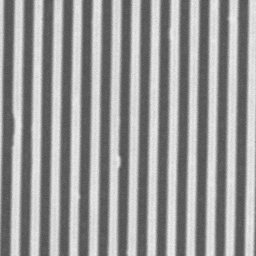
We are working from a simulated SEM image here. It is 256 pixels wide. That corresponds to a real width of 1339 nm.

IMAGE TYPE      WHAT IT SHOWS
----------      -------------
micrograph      parallel lines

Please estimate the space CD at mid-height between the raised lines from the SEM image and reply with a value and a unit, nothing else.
12.2 px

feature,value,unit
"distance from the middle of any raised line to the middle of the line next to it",19.5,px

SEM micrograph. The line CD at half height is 41.2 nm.